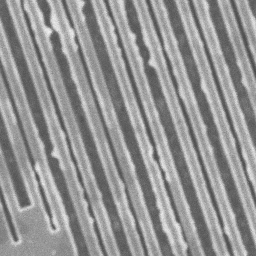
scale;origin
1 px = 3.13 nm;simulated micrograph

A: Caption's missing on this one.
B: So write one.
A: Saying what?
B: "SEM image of parallel lines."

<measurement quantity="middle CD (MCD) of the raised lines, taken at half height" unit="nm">36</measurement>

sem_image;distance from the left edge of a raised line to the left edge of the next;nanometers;62.5